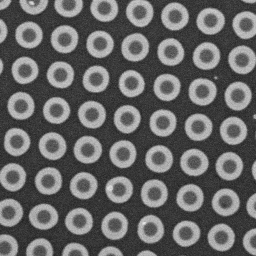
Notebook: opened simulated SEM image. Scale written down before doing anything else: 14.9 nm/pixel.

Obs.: an array of small figures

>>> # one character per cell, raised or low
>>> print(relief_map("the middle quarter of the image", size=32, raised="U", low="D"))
UUDDDDDDDDDDDDDDDDDDDDDDDDDDDDDD
UUDDDDUUUUDDDDDDDDDDDDDDDDDDDDDD
UUDDDUUUUUUDDDDUUUUDDDDDDDDDDDDD
UUDDDUUUUUUDDDUUUUUUDDDUUUUUDDDD
UUDDDUUUUUUDDDUUUUUUDDDUUUUUUDDD
UDDDDUUUUUUDDDUUUUUUDDDUUUUUUDDD
DDDDDDUUUUDDDDUUUUUUDDDUUUUUUDDU
DDDDDDDDDDDDDDDUUUUDDDDUUUUUUDDU
DDDDDDDDDDDDDDDDDDDDDDDDUUUUDDDD
UDDDDDUUDDDDDDDDDDDDDDDDDDDDDDDD
UDDDUUUUUUDDDDDUUDDDDDDDDDDDDDDD
UDDDUUUUUUDDDUUUUUDDDDDDDDDDDDDD
UDDDUUUUUUDDDUUUUUUDDDUUUUUDDDDD
UDDDUUUUUUDDDUUUUUUDDDUUUUUUDDDU
DDDDUUUUUUDDDUUUUUUDDDUUUUUUDDUU
DDDDDUUUUDDDDUUUUUDDDDUUUUUUDDUU
DDDDDDDDDDDDDDUUUUDDDDUUUUUDDDUU
DDDDDDDDDDDDDDDDDDDDDDDUUUUDDDDU
DDDDUUUUDDDDDDDDDDDDDDDDDDDDDDDD
DDDUUUUUUDDDDUUUDDDDDDDDDDDDDDDD
DDDUUUUUUDDDUUUUUDDDDDDUDDDDDDDD
DDDUUUUUUDDDUUUUUUDDDUUUUUDDDDDU
DDDUUUUUUDDDUUUUUUDDDUUUUUUDDDUU
DDDUUUUUUDDDUUUUUUDDUUUUUUUDDUUU
DDDDUUUDDDDDUUUUUDDDUUUUUUUDDUUU
DDDDDDDDDDDDDUUUDDDDDUUUUUUDDUUU
DDDDDDDDDDDDDDDDDDDDDDUUUUDDDDUU
DDDDUUDDDDDDDDDDDDDDDDDDDDDDDDDU
DDUUUUUUDDDDDUUDDDDDDDDDDDDDDDDD
DDUUUUUUDDDUUUUUUDDDDUUUDDDDDDDD
DDUUUUUUDDDUUUUUUDDDUUUUUDDDDDUU
DDUUUUUUDDUUUUUUUDDUUUUUUUDDDUUU